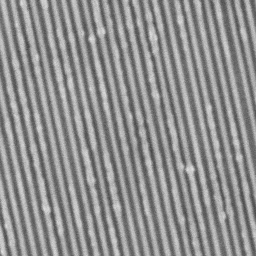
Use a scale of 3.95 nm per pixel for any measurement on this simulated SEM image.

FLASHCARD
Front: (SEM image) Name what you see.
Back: parallel lines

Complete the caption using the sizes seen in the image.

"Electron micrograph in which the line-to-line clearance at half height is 20.8 nm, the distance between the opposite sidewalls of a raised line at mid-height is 17.5 nm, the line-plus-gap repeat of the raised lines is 39.5 nanometers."